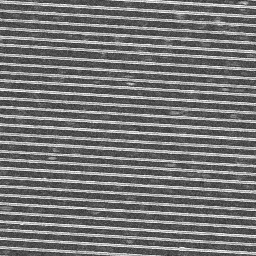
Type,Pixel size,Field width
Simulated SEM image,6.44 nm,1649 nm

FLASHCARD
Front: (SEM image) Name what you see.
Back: parallel lines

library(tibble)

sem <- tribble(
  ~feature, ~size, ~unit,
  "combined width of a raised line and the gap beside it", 8.76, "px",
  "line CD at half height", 15.3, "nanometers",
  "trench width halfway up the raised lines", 0.0426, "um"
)